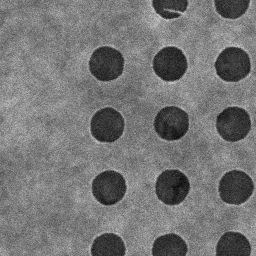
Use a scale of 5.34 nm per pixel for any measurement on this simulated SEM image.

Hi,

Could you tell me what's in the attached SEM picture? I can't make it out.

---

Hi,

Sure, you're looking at a regular array of holes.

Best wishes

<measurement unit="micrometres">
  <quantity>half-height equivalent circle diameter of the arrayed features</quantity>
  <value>0.194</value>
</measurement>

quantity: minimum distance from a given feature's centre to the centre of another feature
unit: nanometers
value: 329